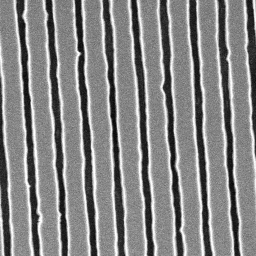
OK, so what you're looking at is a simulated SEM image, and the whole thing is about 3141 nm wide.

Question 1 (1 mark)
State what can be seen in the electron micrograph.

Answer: parallel lines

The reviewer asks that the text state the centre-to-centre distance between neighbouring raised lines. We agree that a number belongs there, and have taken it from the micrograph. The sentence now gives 349 nm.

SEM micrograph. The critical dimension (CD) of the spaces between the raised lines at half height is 0.0933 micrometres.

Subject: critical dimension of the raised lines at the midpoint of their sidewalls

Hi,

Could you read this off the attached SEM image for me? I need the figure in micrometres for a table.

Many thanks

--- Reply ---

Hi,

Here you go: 0.26